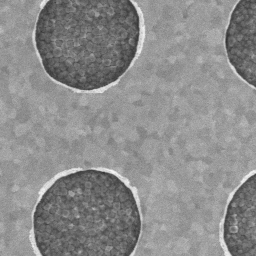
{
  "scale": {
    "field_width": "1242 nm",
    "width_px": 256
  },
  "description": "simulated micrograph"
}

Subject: holes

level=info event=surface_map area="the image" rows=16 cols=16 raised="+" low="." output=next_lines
+++......++++++.
++.......+++++..
++.......+++++..
++......++++++..
+++.....+++++++.
+++++.++++++++++
++++++++++++++++
++++++++++++++++
++++++++++++++++
++++++++++++++++
++++++++++++++++
+++.....+++++++.
++......++++++..
++.......+++++..
++.......+++++..
++......++++++..